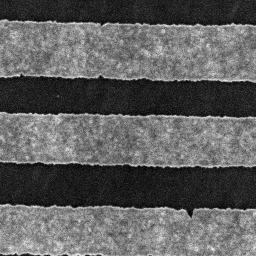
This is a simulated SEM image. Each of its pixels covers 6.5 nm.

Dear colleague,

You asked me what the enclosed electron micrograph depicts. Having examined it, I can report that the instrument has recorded one or a few lines or trenches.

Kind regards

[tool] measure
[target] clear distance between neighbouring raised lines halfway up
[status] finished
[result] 263 nm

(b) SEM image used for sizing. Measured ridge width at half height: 0.324 microns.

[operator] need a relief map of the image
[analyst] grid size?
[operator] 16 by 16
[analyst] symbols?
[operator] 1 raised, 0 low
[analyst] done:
0000000000000000
1111110000000000
1111111111111111
1111111111111111
1111111111111111
0000000000000000
0000000000000000
1111111111111111
1111111111111111
1111111111111111
0000000000000000
0000000000000000
0000000000000000
1111111111111111
1111111111111111
1111111111111111